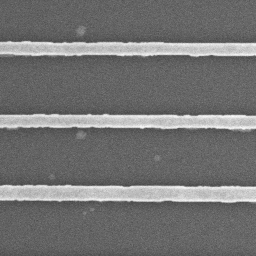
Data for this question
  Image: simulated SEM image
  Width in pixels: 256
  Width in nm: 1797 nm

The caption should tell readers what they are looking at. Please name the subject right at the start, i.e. lines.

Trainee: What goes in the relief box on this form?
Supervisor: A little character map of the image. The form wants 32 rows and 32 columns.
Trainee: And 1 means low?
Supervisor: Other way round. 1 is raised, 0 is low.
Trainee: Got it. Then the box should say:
00000000000000000000000000000000
00000000000000000000000000000000
00000000000000000000000000000000
00000000000000000000000000000000
00000000000000000000000000000000
11111111111111111111111111111111
11111111111111111111111111111111
00000000000000000000000000000000
00000000000000000000000000000000
00000000000000000000000000000000
00000000000000000000000000000000
00000000000000000000000000000000
00000000000000000000000000000000
00000000000000000000000000000000
11111111111111111111110101111110
11111111111111111111111111111111
00000000000000000000000000000000
00000000000000000000000000000000
00000000000000000000000000000000
00000000000000000000000000000000
00000000000000000000000000000000
00000000000000000000000000000000
00000000000000000000000000000000
11111111111111111111111111111111
11111111111111111111111111111111
00000000000000000000000000000000
00000000000000000000000000000000
00000000000000000000000000000000
00000000000000000000000000000000
00000000000000000000000000000000
00000000000000000000000000000000
00000000000000000000000000000000